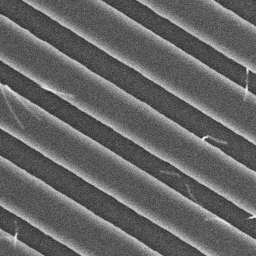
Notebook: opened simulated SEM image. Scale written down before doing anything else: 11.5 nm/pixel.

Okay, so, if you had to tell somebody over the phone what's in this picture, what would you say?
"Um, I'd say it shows lines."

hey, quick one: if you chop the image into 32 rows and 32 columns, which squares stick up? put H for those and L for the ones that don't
LLLLHHHHHHHHHLLLLLHHHHHHHHHLLLLL
LLLLLHHHHHHHHHHLLLLHHHHHHHHHHLLL
HLLLLLLHHHHHHHHHHLLLLHHHHHHHHHHL
HHHLLLLLHHHHHHHHHHLLLLLHHHHHHHHH
HHHHLLLLLLHHHHHHHHHHLLLLHHHHHHHH
HHHHHHLLLLLLHHHHHHHHHLLLLLHHHHHH
HHHHHHHHLLLLLHHHHHHHHHHLLLLLHHHH
HHHHHHHHHLLLLLLHHHHHHHHHHLLLLHHH
LLHHHHHHHHHLLLLLHHHHHHHHHHLLLLLH
LLLHHHHHHHHHLLLLLLHHHHHHHHHHLLLL
LLLLLHHHHHHHHHLLLLLLHHHHHHHHHHLL
HHLLLLHHHHHHHHHHLLLLLHHHHHHHHHHL
HHHLLLLLHHHHHHHHHLLLLLLHHHHHHHHH
HHHHHLLLLLHHHHHHHHHLLLLLHHHHHHHH
HHHHHHHLLLLHHHHHHHHHLLLLLLHHHHHH
HHHHHHHHLLLLLHHHHHHHHHLLLLLLHHHH
LHHHHHHHHHLLLLLHHHHHHHHHLLLLLHHH
LLLHHHHHHHHHLLLLHHHHHHHHHLLLLLLH
LLLLHHHHHHHHHLLLLLHHHHHHHHHLLLLL
LLLLLLHHHHHHHHHLLLLLHHHHHHHHHLLL
HHLLLLLHHHHHHHHHLLLLLHHHHHHHHHLL
HHHLLLLLLHHHHHHHHHLLLLLHHHHHHHHH
HHHHHLLLLLLHHHHHHHHHLLLLLHHHHHHH
HHHHHHHLLLLLHHHHHHHHHLLLLLHHHHHH
HHHHHHHHLLLLLLHHHHHHHHHLLLLLHHHH
HHHHHHHHHHLLLLLLHHHHHHHHHLLLLHHH
LHHHHHHHHHHLLLLLLHHHHHHHHHLLLLLH
LLLHHHHHHHHHHLLLLLLHHHHHHHHHLLLL
LLLLLHHHHHHHHHHLLLLLHHHHHHHHHLLL
HHLLLLHHHHHHHHHHLLLLLLHHHHHHHHHL
HHHLLLLLHHHHHHHHHHLLLLLLHHHHHHHH
HHHHHLLLLLHHHHHHHHHHLLLLLHHHHHHH